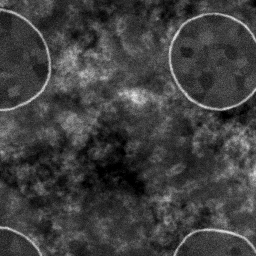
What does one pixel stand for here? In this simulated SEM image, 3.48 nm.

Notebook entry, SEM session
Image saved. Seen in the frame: raised bodies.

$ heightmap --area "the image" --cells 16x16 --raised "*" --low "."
................
**..........***.
***........*****
***........*****
***........*****
***........*****
*...........***.
................
................
................
................
................
................
................
*...........**..
**.........*****